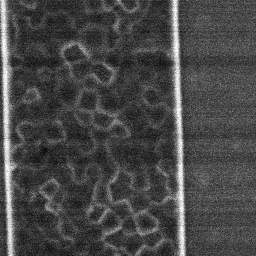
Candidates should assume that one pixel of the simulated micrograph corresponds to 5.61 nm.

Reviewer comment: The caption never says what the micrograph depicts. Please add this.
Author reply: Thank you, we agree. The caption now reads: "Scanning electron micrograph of one or a few lines or trenches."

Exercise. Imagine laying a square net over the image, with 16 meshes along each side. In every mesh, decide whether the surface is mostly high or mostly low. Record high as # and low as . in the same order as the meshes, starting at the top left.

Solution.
###########.....
###########.....
###########.....
###########.....
###########.....
###########.....
###########.....
###########.....
###########.....
###########.....
###########.....
###########.....
.##########.....
.##########.....
.##########.....
.##########.....